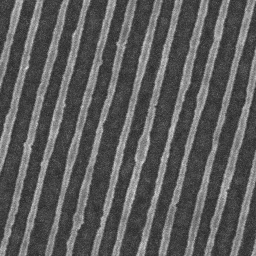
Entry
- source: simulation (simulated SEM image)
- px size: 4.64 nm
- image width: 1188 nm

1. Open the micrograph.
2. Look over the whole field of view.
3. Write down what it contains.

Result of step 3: parallel lines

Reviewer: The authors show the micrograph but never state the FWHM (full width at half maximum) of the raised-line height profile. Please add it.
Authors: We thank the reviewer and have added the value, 27.6 nanometers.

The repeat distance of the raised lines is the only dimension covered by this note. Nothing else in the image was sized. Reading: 105 nm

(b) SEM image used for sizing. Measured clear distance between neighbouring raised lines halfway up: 75.4 nanometres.